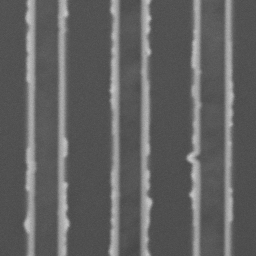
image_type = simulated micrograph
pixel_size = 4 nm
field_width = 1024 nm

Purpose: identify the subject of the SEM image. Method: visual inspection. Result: one or a few lines or trenches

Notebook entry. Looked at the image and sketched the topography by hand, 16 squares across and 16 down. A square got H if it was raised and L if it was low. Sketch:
HHLLHHHLLHHHLLHH
HHLLHHHLLHHHLLHH
HHLLHHHLLHHHLLHH
HHLLHHHLLHHHLLHH
HHLLHHHLLHHHLLHH
HHLLHHHLLHHHLLHH
HHLLHHHLLHHHLLHH
HHLLHHHLLHHHLLHH
HHLLHHHLLHHHLLHH
HHLLHHHLLHHHLLHH
HHLLHHHLLHHHLLHH
HHLLHHHLLHHHLLHH
HHLLHHHLLHHHLLHH
HHLLHHHLLHHHLLHH
HHLLHHHLLHHHLLHH
HHLLHHHLLHHHLLHH